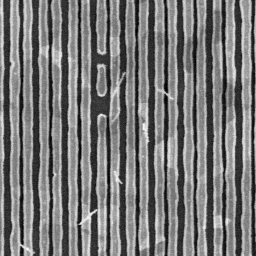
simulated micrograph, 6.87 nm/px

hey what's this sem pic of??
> parallel lines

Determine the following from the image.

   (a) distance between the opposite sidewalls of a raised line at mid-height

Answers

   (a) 50.7 nanometres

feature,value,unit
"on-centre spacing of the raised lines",99.4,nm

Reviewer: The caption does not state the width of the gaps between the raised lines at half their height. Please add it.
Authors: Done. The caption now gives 50.7 nanometres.